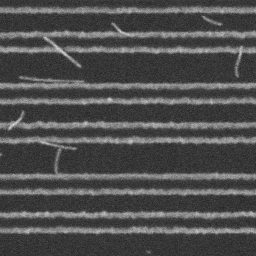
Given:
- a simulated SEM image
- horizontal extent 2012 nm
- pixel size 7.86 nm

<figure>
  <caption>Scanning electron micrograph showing lines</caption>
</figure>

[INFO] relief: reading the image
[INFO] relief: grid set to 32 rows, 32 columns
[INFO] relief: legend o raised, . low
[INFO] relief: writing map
oooooooooooooooooooooooooooooooo
................................
................................
................................
oooooooooooooooooooooooooooooooo
oooooooooooooooooooooooooooooooo
.......oo..........o..........o.
................................
................................
................................
................................
oooooooooooooooooooooooooooooooo
oooooooooooooooooooooooooooooooo
................................
................................
.oo.o.o..oooo......o.o.........o
oooooooooooooooooooooooooooooooo
oooooooooooooooooooooooooooooooo
................................
................................
................................
................................
oooooooooooooooooooooooooooooooo
oooooooooooooooooooooooooooooooo
................................
................................
................................
oooooooooooooooooooooooooooooooo
oooooooooooooooooooooooooooooooo
................................
................................
................................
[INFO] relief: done